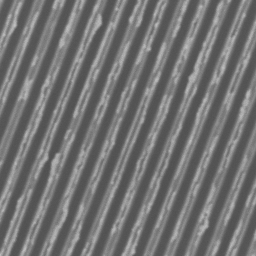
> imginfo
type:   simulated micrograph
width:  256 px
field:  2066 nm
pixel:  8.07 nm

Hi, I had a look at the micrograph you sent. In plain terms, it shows parallel lines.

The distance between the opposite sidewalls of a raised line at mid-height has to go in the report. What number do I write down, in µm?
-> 0.0726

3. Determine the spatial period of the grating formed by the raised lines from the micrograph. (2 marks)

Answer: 156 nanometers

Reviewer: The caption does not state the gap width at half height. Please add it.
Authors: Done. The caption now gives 81 nm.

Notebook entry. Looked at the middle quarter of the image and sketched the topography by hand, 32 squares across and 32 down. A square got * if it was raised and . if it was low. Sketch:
..**...**...**...***...**...**..
..**...**...**...**...***..***..
.***..***...**...**...**...**...
.**...**...**...***..***...**..*
***..***...**...**...**...**...*
**...**...***...**...**...**...*
**...**...**...***..***...**..**
**..***...**...**...**...**...**
*...**...**...***..***...**...**
*...**...**...**...**...***...**
...***...**...**...**...**...**.
...**...**...***...**...**...**.
..***...**...**...**...***..**..
..**...**...***...**...**...**..
..**...**...**...***...**...**..
..**...**...**...**...**...**...
.**...**...**...***...**...**...
***...**...**...**...**...***...
**...***...**...**...**...**...*
**...**...***..***..***...**...*
**..***...**...**...**...***..**
*...**...***...**...**...**...**
*...**...**...**...***...**...**
*...**...**...**...**...**...**.
...**...***...**..***...**...**.
...**...**...**...**...***..***.
..**...***...**...**...**...**..
..**...**...***...**...**...**..
..**...**...**...**...**...***..
.**...***...**...**...**...**...
.**...**...**...**...***...**...
***...**...**...**...**...***..*